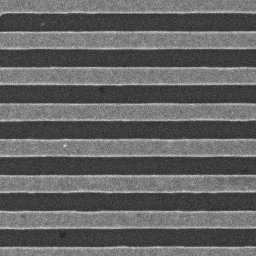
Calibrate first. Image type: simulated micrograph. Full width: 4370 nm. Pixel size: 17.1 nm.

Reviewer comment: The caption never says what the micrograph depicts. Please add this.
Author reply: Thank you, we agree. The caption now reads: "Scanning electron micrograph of wiring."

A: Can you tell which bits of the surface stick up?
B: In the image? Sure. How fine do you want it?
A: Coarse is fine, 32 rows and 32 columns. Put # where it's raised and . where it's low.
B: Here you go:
################################
################################
................................
................................
################################
################################
................................
................................
......####################....##
################################
################################
................................
................................
################################
################################
................................
................................
#####..######..#####..##########
################################
################################
................................
................................
################################
################################
................................
................................
#.########..###########.########
################################
################################
................................
................................
################################